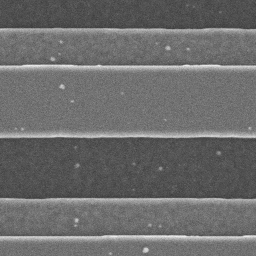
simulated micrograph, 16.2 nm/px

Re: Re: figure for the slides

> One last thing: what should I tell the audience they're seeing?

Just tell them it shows lines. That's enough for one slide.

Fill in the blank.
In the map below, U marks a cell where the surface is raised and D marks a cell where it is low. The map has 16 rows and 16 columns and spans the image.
DDDDDDDDDDDDDDDD
DDDDDDDDDDDDDDDD
UUUUUUUUUUUUUUUU
UUUUUUUUUUUUUUUU
UUUUUUUUUUUUUUUU
UUUUUUUUUUUUUUUU
UUUUUUUUUUUUUUUU
UUUUUUUUUUUUUUUU
UUUUUUUUUUUUUUUU
DDDDDDDDDDDDDDDD
DDDDDDDDDDDDDDDD
DDDDDDDDDDDDDDDD
UUUUUUUUUUUUUUUU
UUUUUUUUUUUUUUUU
UUUUUUUUUUUUUUUU
UUUUUUUUUUUUUUUU